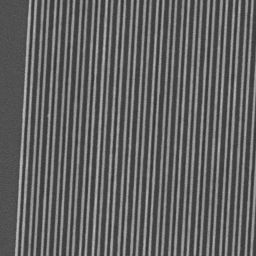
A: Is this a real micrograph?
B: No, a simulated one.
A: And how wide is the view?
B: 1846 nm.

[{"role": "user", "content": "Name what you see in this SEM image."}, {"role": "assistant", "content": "parallel lines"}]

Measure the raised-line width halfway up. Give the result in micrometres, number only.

0.0126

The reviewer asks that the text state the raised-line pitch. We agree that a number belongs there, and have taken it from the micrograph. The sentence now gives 45.8 nanometres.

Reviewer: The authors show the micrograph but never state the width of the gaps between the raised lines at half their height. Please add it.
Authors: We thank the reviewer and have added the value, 0.0315 µm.